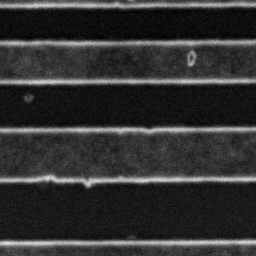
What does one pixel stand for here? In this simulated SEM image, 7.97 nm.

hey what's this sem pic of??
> one or a few lines or trenches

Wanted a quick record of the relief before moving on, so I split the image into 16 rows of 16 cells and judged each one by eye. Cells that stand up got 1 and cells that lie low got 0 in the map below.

0000000000000000
0000000000000000
0000000000000000
1111111111111111
1111111111111111
0000000000000000
0000000000000000
0000000000000000
1111111111111111
1111111111111111
1111111111111111
0000000000000000
0000000000000000
0000000000000000
0000000000000000
1111111111111111